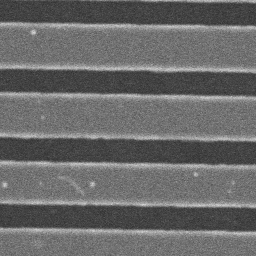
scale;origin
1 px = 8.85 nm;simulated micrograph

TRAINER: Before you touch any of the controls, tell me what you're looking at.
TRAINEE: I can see lines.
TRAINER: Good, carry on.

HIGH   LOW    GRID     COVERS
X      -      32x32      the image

--------------------------------
--------------------------------
--------------------------------
XXXXXXXXXXXXXXXXXXXXXXXXXXXXXXXX
XXXXXXXXXXXXXXXXXXXXXXXXXXXXXXXX
XXXXXXXXXXXXXXXXXXXXXXXXXXXXXXXX
XXXXXXXXXXXXXXXXXXXXXXXXXXXXXXXX
XXXXXXXXXXXXXXXXXXXXXXXXXXXXXXXX
---XXXXXXXXXXXXXXXXXXXXXXXXXXXXX
--------------------------------
--------------------------------
--------------------------------
XXXXXXXXXXXXXXXXXXXXXXXXXXXXXXXX
XXXXXXXXXXXXXXXXXXXXXXXXXXXXXXXX
XXXXXXXXXXXXXXXXXXXXXXXXXXXXXXXX
XXXXXXXXXXXXXXXXXXXXXXXXXXXXXXXX
XXXXXXXXXXXXXXXXXXXXXXXXXXXXXXXX
-----------------------------XXX
--------------------------------
--------------------------------
XXXXXXXXXXXXXXX-----------------
XXXXXXXXXXXXXXXXXXXXXXXXXXXXXXXX
XXXXXXXXXXXXXXXXXXXXXXXXXXXXXXXX
XXXXXXXXXXXXXXXXXXXXXXXXXXXXXXXX
XXXXXXXXXXXXXXXXXXXXXXXXXXXXXXXX
--------XXXXXXXXXXXXXXXXXXXXXXXX
--------------------------------
--------------------------------
--------------------------------
XXXXXXXXXXXXXXXXXXXXXXXXXXXXXXXX
XXXXXXXXXXXXXXXXXXXXXXXXXXXXXXXX
XXXXXXXXXXXXXXXXXXXXXXXXXXXXXXXX